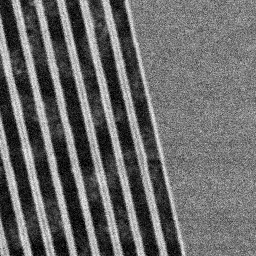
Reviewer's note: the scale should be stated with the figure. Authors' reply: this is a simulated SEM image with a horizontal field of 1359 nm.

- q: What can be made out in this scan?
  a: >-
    parallel lines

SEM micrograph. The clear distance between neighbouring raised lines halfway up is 0.0913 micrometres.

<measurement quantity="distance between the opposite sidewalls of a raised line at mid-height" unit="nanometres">25.3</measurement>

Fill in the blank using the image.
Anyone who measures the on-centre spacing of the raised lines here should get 117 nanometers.